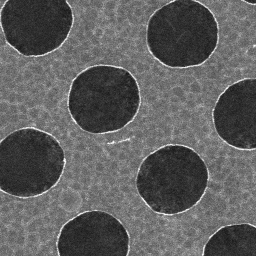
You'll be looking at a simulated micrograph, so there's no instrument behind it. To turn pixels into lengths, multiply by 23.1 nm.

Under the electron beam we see holes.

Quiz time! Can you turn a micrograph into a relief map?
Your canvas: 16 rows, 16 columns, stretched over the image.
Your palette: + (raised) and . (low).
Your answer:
....++++++...+++
....+++++.....++
....+++++.....++
++++++++++...+++
+++++...++++++++
++++.....+++++..
++++.....+++++..
+++++...+++++...
+..+++++++++++..
....++++++..++++
....+++++....+++
...++++++....+++
+++++++++...++++
+++++..+++++++++
++++....++++++..
++++....+++++...